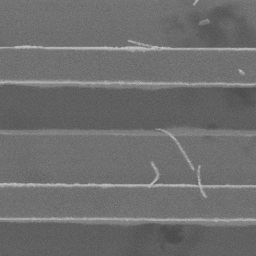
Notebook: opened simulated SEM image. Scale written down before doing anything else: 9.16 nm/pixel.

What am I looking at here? lines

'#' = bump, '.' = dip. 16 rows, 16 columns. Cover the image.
################
################
################
################
################
................
................
................
################
################
################
################
################
################
................
................